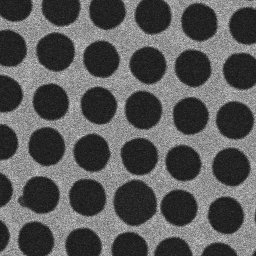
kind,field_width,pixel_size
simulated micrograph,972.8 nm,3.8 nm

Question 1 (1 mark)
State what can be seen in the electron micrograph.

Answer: a regular array of holes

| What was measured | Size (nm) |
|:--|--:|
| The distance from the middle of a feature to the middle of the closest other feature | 170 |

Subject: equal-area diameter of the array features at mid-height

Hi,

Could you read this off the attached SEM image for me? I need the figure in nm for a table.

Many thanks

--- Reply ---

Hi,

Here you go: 143